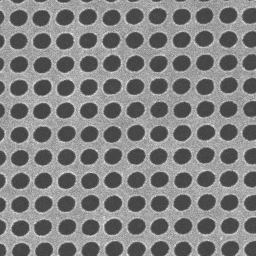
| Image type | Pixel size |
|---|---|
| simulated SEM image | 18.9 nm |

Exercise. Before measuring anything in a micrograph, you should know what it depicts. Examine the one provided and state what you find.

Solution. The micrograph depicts a regular array of holes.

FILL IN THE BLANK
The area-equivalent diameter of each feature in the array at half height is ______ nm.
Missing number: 332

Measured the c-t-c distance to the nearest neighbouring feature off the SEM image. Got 431 nm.